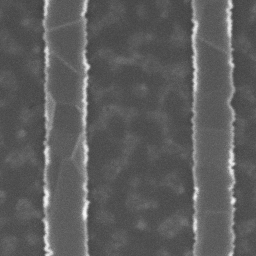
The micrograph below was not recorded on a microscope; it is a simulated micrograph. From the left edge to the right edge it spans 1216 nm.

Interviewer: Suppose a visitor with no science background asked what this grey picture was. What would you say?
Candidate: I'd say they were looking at one or a few lines or trenches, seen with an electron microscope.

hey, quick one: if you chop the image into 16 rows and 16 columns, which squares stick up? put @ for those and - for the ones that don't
---@@-------@@--
---@@-------@@--
---@@-------@@--
---@@-------@@--
---@@-------@@@-
---@@-------@@@-
---@@-------@@--
---@@-------@@@-
---@@-------@@@-
---@@-------@@@-
---@@-------@@@-
---@@-------@@@-
---@@-------@@@-
---@@-------@@@-
---@@-------@@@-
---@@-------@@@-